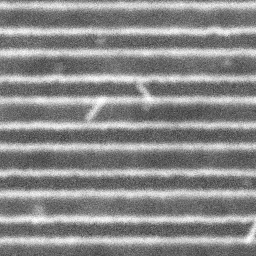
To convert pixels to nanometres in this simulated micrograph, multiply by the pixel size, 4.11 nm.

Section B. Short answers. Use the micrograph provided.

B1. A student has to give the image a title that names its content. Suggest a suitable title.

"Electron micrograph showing lines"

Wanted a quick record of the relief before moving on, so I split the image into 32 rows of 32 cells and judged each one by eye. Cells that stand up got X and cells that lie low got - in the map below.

----X--------------------------X
XXXXXXXXXXXXXXXXXXXXXXXXXXXXXXXX
XXXXXXXXXXXXXXXXXXXXXXXXXXXXXXXX
XXXXXXXXXXXXXXXXXXXXXXXXXXXXXXXX
--------------------------------
--------------------------------
XXXXXXXXXXXXXXXXXXXXXXXXXXXXXXXX
XXXXXXXXXXXXXXXXXXXXXXXXXXXXXXXX
XXXXXXXXXXXXXXXXXXXXXXXXXXXXXXXX
XXXXXXXXXXXXXXXXXXXXXXXXXXXXXXXX
--------------------------------
--------------------------------
XXXXXXXXXXXXXXXXXXXXXXXXXXXXXXXX
XXXXXXXXXXXXXXXXXXXXXXXXXXXXXXXX
XXXXXXXXXXXXXXXXXXXXXXXXXXXXXXXX
XXXXXXXXXXXXXXXXXXXXXXXXXXXXXXXX
--------------------------------
--------------------------------
XXXXXXXXXXXXXXXXXXXXXXXXXXXXXXXX
XXXXXXXXXXXXXXXXXXXXXXXXXXXXXXXX
XXXXXXXXXXXXXXXXXXXXXXXXXXXXXXXX
XXXXXXXXXXXXXXXXXXXXXXXXXXXXXXXX
--------------------------------
--------------------------------
XXXXXXXXXXXXXXXXXXXXXXXXXXXXXXXX
XXXXXXXXXXXXXXXXXXXXXXXXXXXXXXXX
XXXXXXXXXXXXXXXXXXXXXXXXXXXXXXXX
XXXXXXX-XXXXXXXXXXXXXXXXXXXXXXX-
--------------------------------
--------------------------------
XXXXXXXXXXXXXXXXXXXXXXXXXXXXXXXX
XXXXXXXXXXXXXXXXXXXXXXXXXXXXXXXX